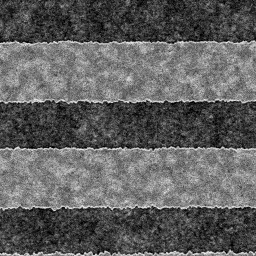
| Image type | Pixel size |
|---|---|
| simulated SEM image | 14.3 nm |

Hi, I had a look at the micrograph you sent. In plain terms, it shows one or a few lines or trenches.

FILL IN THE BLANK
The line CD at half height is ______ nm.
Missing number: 833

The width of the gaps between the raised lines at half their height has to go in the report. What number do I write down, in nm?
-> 665